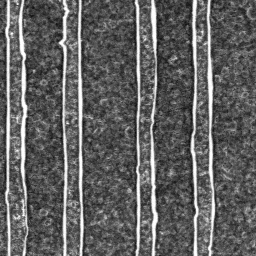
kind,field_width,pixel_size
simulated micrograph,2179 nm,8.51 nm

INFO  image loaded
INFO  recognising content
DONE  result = one or a few lines or trenches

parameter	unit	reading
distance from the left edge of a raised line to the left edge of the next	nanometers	529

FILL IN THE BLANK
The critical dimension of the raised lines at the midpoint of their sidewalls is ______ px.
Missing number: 16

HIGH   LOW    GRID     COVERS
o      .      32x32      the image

.oo.....oo.......oo.....oo......
.oo.....oo.......oo.....oo......
.oo.....oo.......oo.....oo......
.oo.....oo.......oo.....oo......
.oo.....oo.......oo.....oo......
.oo.....oo.......oo.....oo......
.oo.....oo.......oo.....oo......
.oo.....oo.......oo.....oo......
.oo.....oo.......oo.....oo......
.oo.....oo.......ooo....oo......
.oo.....oo.......ooo....oo......
.oo.....oo.......oo.....oo......
.oo.....oo.......oo.....oo......
.oo.....oo.......oo.....oo......
.oo.....oo.......oo.....oo......
.oo.....oo.......oo.....oo......
.oo.....oo.......oo.....oo......
.oo.....oo.......oo.....oo......
.oo.....oo.......oo.....oo......
.oo.....oo.......oo.....oo......
.oo.....oo.......oo.....oo......
.oo.....oo.......oo.....oo......
.oo.....oo.......oo.....oo......
.oo.....oo.......oo.....ooo.....
.oo.....oo.......oo.....ooo.....
.oo.....oo.......oo.....ooo.....
.oo.....oo.......oo.....ooo.....
.oo.....oo.......oo.....ooo.....
.oo.....oo.......oo.....oo......
.oo.....oo.......oo.....oo......
.oo.....oo.......oo.....oo......
.oo.....oo.......oo.....oo......